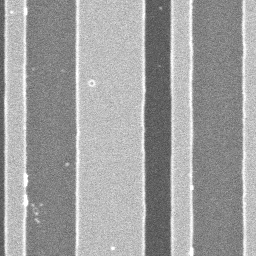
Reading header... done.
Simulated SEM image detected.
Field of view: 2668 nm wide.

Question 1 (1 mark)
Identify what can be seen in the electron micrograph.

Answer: lines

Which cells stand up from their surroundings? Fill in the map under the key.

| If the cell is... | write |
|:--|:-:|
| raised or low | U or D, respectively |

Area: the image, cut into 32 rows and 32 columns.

DUUDDDDDDDUUUUUUUUDDDDUUDDDDDDUU
DUUDDDDDDDUUUUUUUUDDDDUUDDDDDDUU
DUUDDDDDDDUUUUUUUUDDDDUUDDDDDDUU
DUUDDDDDDDUUUUUUUUDDDUUUDDDDDDUU
DUUDDDDDDDUUUUUUUUDDDUUUDDDDDDUU
DUUDDDDDDDUUUUUUUUDDDUUUDDDDDDUU
DUUDDDDDDDUUUUUUUUDDDUUUDDDDDDDU
DUUDDDDDDDUUUUUUUUDDDUUUDDDDDDUU
DUUDDDDDDDUUUUUUUUDDDUUUDDDDDDUU
DUUDDDDDDDUUUUUUUUDDDUUUDDDDDDUU
DUUDDDDDDDUUUUUUUUDDDDUUDDDDDDUU
DUUDDDDDDDUUUUUUUUDDDDUUDDDDDDUU
DUUDDDDDDDUUUUUUUUDDDDUUDDDDDDUU
DUUDDDDDDDUUUUUUUUDDDDUUDDDDDDUU
DUUDDDDDDDUUUUUUUUDDDDUUDDDDDDUU
DUUDDDDDDDUUUUUUUUDDDDUUDDDDDDUU
DUUDDDDDDDUUUUUUUUDDDDUUDDDDDDUU
DUUDDDDDDDUUUUUUUUDDDDUUDDDDDDUU
DUUDDDDDDDUUUUUUUUDDDDUUDDDDDDUU
DUUDDDDDDDUUUUUUUUDDDDUUDDDDDDUU
DUUDDDDDDDUUUUUUUUDDDDUUDDDDDDUU
DUUDDDDDDDUUUUUUUUDDDDUUDDDDDDUU
DUUDDDDDDDUUUUUUUUDDDDUUDDDDDDUU
DUUDDDDDDDUUUUUUUUDDDDUUDDDDDDUU
DUUDDDDDDDUUUUUUUUDDDDUUDDDDDDUU
DUUDDDDDDDUUUUUUUUDDDDUUDDDDDDUU
DUUDDDDDDDUUUUUUUUDDDDUUDDDDDDUU
DUUDDDDDDDUUUUUUUUDDDUUUDDDDDDUU
DUUDDDDDDDUUUUUUUUDDDUUUDDDDDDDU
DUUDDDDDDDUUUUUUUUDDDDUUDDDDDDDU
DUUDDDDDDDUUUUUUUUDDDDUUDDDDDDDU
DUUDDDDDDDUUUUUUUUDDDDUUDDDDDDDU